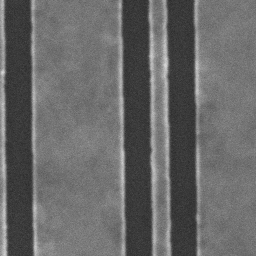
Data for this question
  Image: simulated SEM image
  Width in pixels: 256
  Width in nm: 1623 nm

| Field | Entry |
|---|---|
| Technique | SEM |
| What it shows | lines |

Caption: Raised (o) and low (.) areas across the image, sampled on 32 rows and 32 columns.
....ooooooooooo....oo...oooooooo
....ooooooooooo....oo...oooooooo
....ooooooooooo....oo...oooooooo
....ooooooooooo....oo...oooooooo
o...ooooooooooo....oo...oooooooo
o...ooooooooooo....oo...oooooooo
o...ooooooooooo....oo...oooooooo
o...ooooooooooo....oo...oooooooo
o...ooooooooooo....oo...oooooooo
o...ooooooooooo....oo...oooooooo
....ooooooooooo....oo...oooooooo
o...ooooooooooo....oo...oooooooo
o...ooooooooooo....oo...oooooooo
o...ooooooooooo....oo....ooooooo
o...ooooooooooo....oo....ooooooo
o...ooooooooooo....oo....ooooooo
o...ooooooooooo....oo....ooooooo
o...ooooooooooo....oo....ooooooo
o...ooooooooooo....oo....ooooooo
o...ooooooooooo....oo....ooooooo
o...ooooooooooo....oo....ooooooo
o...ooooooooooo....oo....ooooooo
o...ooooooooooo....oo....ooooooo
o...ooooooooooo....oo....ooooooo
o...ooooooooooo....oo....ooooooo
o...ooooooooooo....oo....ooooooo
o...ooooooooooo....oo....ooooooo
o...oooooooooooo...oo....ooooooo
o...oooooooooooo...oo....ooooooo
o...oooooooooooo...oo....ooooooo
o...oooooooooooo...oo....ooooooo
o...oooooooooooo...oo....ooooooo